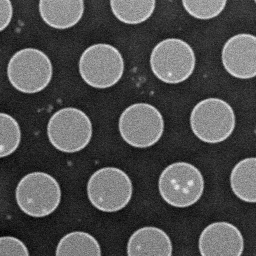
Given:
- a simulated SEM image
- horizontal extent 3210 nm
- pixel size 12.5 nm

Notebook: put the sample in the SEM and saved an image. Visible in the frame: an array of small figures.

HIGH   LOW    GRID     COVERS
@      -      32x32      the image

@----@@@@@----@@@@@----@@@@@----
@----@@@@@----@@@@@-----@@@-----
@-----@@@@-----@@@--------------
-------@------------------------
-----------------------------@@@
--------------------@@@-----@@@@
--@@@------@@@@----@@@@@----@@@@
-@@@@@----@@@@@----@@@@@----@@@@
-@@@@@----@@@@@----@@@@@----@@@@
-@@@@@----@@@@@-----@@@@-----@@@
--@@@@-----@@@------------------
---@----------------------------
--------------------------@-----
----------------@@@-----@@@@@---
@------@@@@----@@@@@----@@@@@---
@@----@@@@@----@@@@@----@@@@@---
@@----@@@@@----@@@@@----@@@@@---
@@----@@@@@-----@@@@-----@@@----
@@-----@@@----------------------
@-------------------------------
----------------------@-------@@
------------@@@-----@@@@@----@@@
---@@@@----@@@@@----@@@@@----@@@
--@@@@@----@@@@@----@@@@@----@@@
--@@@@@----@@@@@----@@@@@-----@@
--@@@@@-----@@@@-----@@@--------
---@@@--------------------------
--------------------------------
------------------@-------@@@---
--------@@@------@@@@----@@@@@--
@@@----@@@@@----@@@@@----@@@@@--
@@@----@@@@@----@@@@@----@@@@@--